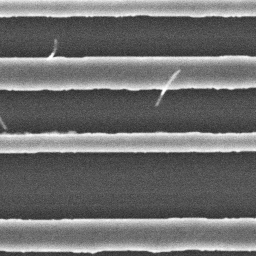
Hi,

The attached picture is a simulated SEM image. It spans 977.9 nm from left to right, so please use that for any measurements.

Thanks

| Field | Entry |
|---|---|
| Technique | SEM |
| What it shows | lines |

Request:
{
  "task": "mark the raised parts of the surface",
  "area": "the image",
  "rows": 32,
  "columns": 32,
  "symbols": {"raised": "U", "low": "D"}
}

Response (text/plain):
UUUUUUUUUUUUUUUUUUUUUUUUUUUUUUUU
UUUUUUUUUUUUUUUUUUUUUUUUUUUUUUUU
DDDDDDDDDDDDDDDDDDDDDDDDDDDDDDDD
DDDDDDDDDDDDDDDDDDDDDDDDDDDDDDDD
DDDDDDDDDDDDDDDDDDDDDDDDDDDDDDDD
DDDDDDDDDDDDDDDDDDDDDDDDDDDDDDDD
DDDDDDDDDDDDDDDDDDDDDDDDDDDDDDDD
UUUUUUUUUUUUUUUUUUUUUUUUUUUUUUUU
UUUUUUUUUUUUUUUUUUUUUUUUUUUUUUUU
UUUUUUUUUUUUUUUUUUUUUUUUUUUUUUUU
UUUUUUUUUUUUUUUUUUUUUUUUUUUUUUUU
DDDDDDDDDDDDDDDDDDDDDDDDDDDDDDDD
DDDDDDDDDDDDDDDDDDDDDDDDDDDDDDDD
DDDDDDDDDDDDDDDDDDDDDDDDDDDDDDDD
DDDDDDDDDDDDDDDDDDDDDDDDDDDDDDDD
DDDDDDDDDDDDDDDDDDDDDDDDDDDDDDDD
DDDDDDDDDDDDDDDDDDDDDDDDDDDDDDDD
UUUUUUUUUUUUUUUUUUUUUUUUUUUUUUUU
UUUUUUUUUUUUUUUUUUUUUUUUUUUUUUUU
DDDDDDDDDDDDDDDDDDDDDDDDDDDDDDDD
DDDDDDDDDDDDDDDDDDDDDDDDDDDDDDDD
DDDDDDDDDDDDDDDDDDDDDDDDDDDDDDDD
DDDDDDDDDDDDDDDDDDDDDDDDDDDDDDDD
DDDDDDDDDDDDDDDDDDDDDDDDDDDDDDDD
DDDDDDDDDDDDDDDDDDDDDDDDDDDDDDDD
DDDDDDDDDDDDDDDDDDDDDDDDDDDDDDDD
DDDDDDDDDDDDDDDDDDDDDDDDDDDDDDDD
UUUUDDUUUUUUUUUUUUUUUUUUUUUUUUUU
UUUUUUUUUUUUUUUUUUUUUUUUUUUUUUUU
UUUUUUUUUUUUUUUUUUUUUUUUUUUUUUUU
UUUUUUUUUUUUUUUUUUUUUUUUUUUUUUUU
DDDDDDDDDDDUDDDDDDDDDDDDDDDDDDDD